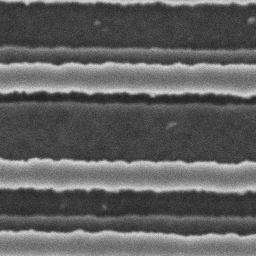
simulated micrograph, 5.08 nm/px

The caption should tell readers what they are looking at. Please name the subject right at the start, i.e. lines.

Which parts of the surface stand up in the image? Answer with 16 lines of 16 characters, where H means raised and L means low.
LLLLLLLLLLLLLLLL
LLLLLLLLLLLLLLLL
LLLLLLLLLLLLLLLL
LLLLLLLLLLLLLLLL
HHHHHHHHHHHHHHHH
HHHHHHHHHHHHHHHH
LLLLLLLLLLLLLLLL
LLLLLLLLLLLLLLLL
LLLLLLLLLLLLLLLL
LLLLLLLLLLLLLLLL
HHHHHHHHHHHHHHHH
HHHHHHHHHHHHHHHH
LLLLLLLLLLLLLLLL
LLLLLLLLLLLLLLLL
HHLLLLLLLLLLLLLL
HHHHHHHHHHHHHHHH